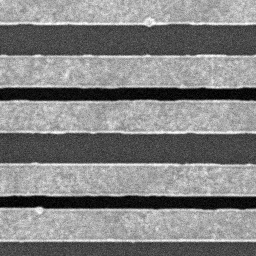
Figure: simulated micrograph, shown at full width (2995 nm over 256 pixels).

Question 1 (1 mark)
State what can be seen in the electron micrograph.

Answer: lines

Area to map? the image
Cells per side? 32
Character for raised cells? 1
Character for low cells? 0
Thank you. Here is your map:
11111111111111111111111111111111
11111111111111111111111111111111
11111111111111111111111111111111
00000000000000000000000000000000
00000000000000000000000000000000
00000000000000000000000000000000
00000000000000000000000000000000
11111111111111111111111111111111
11111111111111111111111111111111
11111111111111111111111111111111
11111111111111111111111111111111
00000000000000000000000000000000
00000000000000000000000000000000
11111111111111111111111111111111
11111111111111111111111111111111
11111111111111111111111111111111
00000111000100011111111111111101
00000000000000000000000000000000
00000000000000000000000000000000
00000000000000000000000000000000
00000000000000000000000000000000
11111111111111111111111111111111
11111111111111111111111111111111
11111111111111111111111111111111
00000000000000000000000000000000
00000000000000000000000000000000
11111111111111111111111111111111
11111111111111111111111111111111
11111111111111111111111111111111
11111111111111111111111111111111
00000000000000000000000000000000
00000000000000000000000000000000